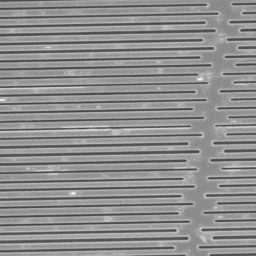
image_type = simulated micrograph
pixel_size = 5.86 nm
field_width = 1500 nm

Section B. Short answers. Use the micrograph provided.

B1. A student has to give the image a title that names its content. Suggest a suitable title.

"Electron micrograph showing parallel lines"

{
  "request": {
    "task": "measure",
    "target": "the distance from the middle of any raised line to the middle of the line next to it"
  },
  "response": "0.0506 microns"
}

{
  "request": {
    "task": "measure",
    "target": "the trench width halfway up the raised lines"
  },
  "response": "16.1 nm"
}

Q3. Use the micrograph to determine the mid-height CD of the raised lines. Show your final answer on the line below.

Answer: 37.3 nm